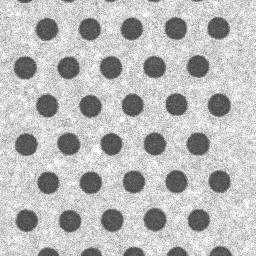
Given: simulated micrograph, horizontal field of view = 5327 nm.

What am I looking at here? a regular array of holes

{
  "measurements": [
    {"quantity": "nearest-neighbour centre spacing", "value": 0.885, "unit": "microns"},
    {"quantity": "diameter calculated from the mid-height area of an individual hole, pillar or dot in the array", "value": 485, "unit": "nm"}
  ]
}